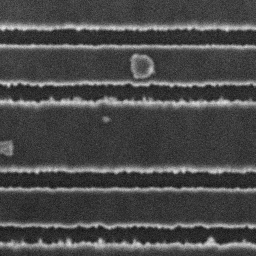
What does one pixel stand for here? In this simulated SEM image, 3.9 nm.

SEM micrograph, lines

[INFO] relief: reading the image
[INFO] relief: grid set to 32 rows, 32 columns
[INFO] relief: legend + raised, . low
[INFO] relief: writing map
++++++++++++++++++++++++++++++++
++++++++++++++++++++++++++++++++
++++++++++++++++++++++++++++++++
++++++++++++++++++++++++++++++++
................................
................................
++++++++++++++++++++++++++++++++
++++++++++++++++++++++++++++++++
++++++++++++++++++++++++++++++++
++++++++++++++++++++++++++++++++
++.+++++++++++++++++++++++++++++
................................
................................
++++++++++++++++++++++++++++++++
++++++++++++++++++++++++++++++++
++++++++++++++++++++++++++++++++
++++++++++++++++++++++++++++++++
++++++++++++++++++++++++++++++++
++++++++++++++++++++++++++++++++
++++++++++++++++++++++++++++++++
++++++++++++++++++++++++++++++++
....+.............+.......++....
................................
+++.++.+.+....+...++++.+++......
++++++++++++++++++++++++++++++++
++++++++++++++++++++++++++++++++
++++++++++++++++++++++++++++++++
++++++++++++++++++++++++++++++++
.............+.......+..........
................................
+......++.++...+.........++..++.
++++++++++++++++++++++++++++++++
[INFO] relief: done